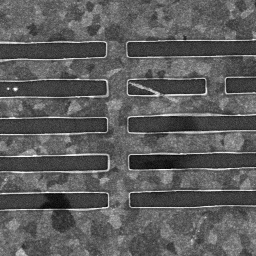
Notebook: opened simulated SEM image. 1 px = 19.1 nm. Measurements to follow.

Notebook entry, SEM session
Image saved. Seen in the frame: groups of lines, slits or small figures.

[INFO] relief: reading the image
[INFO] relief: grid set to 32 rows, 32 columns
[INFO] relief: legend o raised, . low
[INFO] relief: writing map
oooooooooooooooooooooooooooooooo
oooooooooooooooooooooooooooooooo
oooooooooooooooooooooooooooooooo
oooooooooooooooooooooooooooooooo
oooooooooooooooooooooooooooooooo
.............ooo................
.............ooo................
.oooo..ooooooooooooooooooooooooo
oooooooooooooooooooooooooooooooo
oooooooooooooooooooooooooooooooo
.............ooo..........oo....
..............oo..........oo....
oooooooooooooooooooooooooooooooo
oooooooooooooooooooooooooooooooo
ooooooooooooooooo...............
.............ooo................
.............ooo..........oooooo
oooooooooooooooooooooooooooooooo
oooooooooooooooooooooooooooooooo
oo...........ooo................
..............oo................
............oooooooooooooooooooo
oooooooooooooooooooooooooooooooo
oooooooooooooooooooooooooooooooo
.............ooo................
..............oo................
oooooooooooooooooooooooooooooooo
oooooooooooooooooooooooooooooooo
oooooooooooooooooooooooooooooooo
oooooooooooooooooooooooooooooooo
oooooooooooooooooooooooooooooooo
oooooooooooooooooooooooooooooooo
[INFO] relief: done